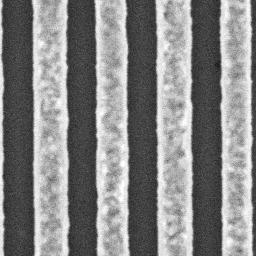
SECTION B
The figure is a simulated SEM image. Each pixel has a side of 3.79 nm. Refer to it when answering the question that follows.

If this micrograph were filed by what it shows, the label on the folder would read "lines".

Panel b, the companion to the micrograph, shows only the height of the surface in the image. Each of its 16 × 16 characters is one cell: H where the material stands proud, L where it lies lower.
LLHHLLHHLLHHLLHH
LLHHLLHHLLHHLLHH
LLHHLLHHLLHHLLHH
LLHHLLHHLLHHLLHH
LLHHLLHHLLHHLLHH
LLHHLLHHLLHHLLHH
LLHHLLHHLLHHLLHH
LLHHLLHHLLHHLLHH
LLHHLLHHLLHHLLHH
LLHHLLHHLLHHLLHH
LLHHLLHHLLHHLLHH
LLHHLLHHLLHHLLHH
LLHHLLHHLLHHLLHH
LLHHLLHHLLHHLLHH
LLHHLLHHLLHHLLHH
LLHHLLHHLLHHLLHH